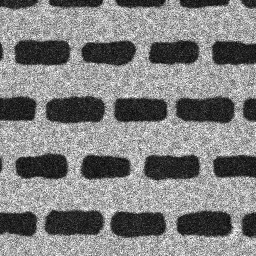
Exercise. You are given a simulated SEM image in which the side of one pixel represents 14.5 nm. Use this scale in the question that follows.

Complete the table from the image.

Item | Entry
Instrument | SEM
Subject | a regular array of holes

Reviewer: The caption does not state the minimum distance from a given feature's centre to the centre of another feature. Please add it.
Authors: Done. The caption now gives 0.94 micrometres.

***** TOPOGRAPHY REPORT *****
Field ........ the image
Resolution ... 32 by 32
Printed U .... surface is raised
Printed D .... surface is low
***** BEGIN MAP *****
DDDDUUDDDDDDDUUDDDDDUUUDDDDDUUDD
UUUUUUUUUUUUUUUUUUUUUUUUUUUUUUUU
UUUUUUUUUUUUUUUUUUUUUUUUUUUUUUUU
UUUUUUUUUUUUUUUUUUUUUUUUUUUUUUUU
UUUUUUUUUUUUUUUUUUUUUUUUUUUUUUUU
UUDDDDDDUUUDDDDDDUUDDDDDDUUDDDDU
UUDDDDDDDUDDDDDDDUUDDDDDDUUDDDDD
UUDDDDDDDUUDDDDDUUUDDDDDDUUDDDDD
UUUUUUUUUUUUUUUUUUUUUUUUUUUUUUUU
UUUUUUUUUUUUUUUUUUUUUUUUUUUUUUUU
UUUUUUUUUUUUUUUUUUUUUUUUUUUUUUUU
UUUUUUUUUUUUUUUUUUUUUUUUUUUUUUUU
DDDDUUDDDDDDDUUDDDDDUUDDDDDDDUUD
DDDDUUDDDDDDDUDDDDDDDUDDDDDDDUDD
DDDDUUDDDDDDDUDDDDDDDUDDDDDDDUDD
UUUUUUUUUUUUUUUUUUUUUUUUUUUUUUUU
UUUUUUUUUUUUUUUUUUUUUUUUUUUUUUUU
UUUUUUUUUUUUUUUUUUUUUUUUUUUUUUUU
UUUUUUUUUUUUUUUUUUUUUUUUUUUUUUUU
UUUUUDDDUUUDUUUUUUUDDUUDUUUUDDDD
UUDDDDDDUUDDDDDDUUDDDDDDDUUDDDDD
UUDDDDDDUUDDDDDDUUDDDDDDDUUDDDDD
UUUUUUUUUUUUUUUUUUUDUUUUUUUUUUUU
UUUUUUUUUUUUUUUUUUUUUUUUUUUUUUUU
UUUUUUUUUUUUUUUUUUUUUUUUUUUUUUUU
UUUUUUUUUUUUUUUUUUUUUUUUUUUUUUUU
UUUDUUDDDDDDUUUUUUUUUUUUUDDDUUUU
DDDDDUDDDDDDDUDDDDDDDUDDDDDDDUDD
DDDDDUDDDDDDDUDDDDDDDUDDDDDDDUDD
UUUUUUUUUUUUUUUDDDUUUUUUUDDDUUUD
UUUUUUUUUUUUUUUUUUUUUUUUUUUUUUUU
UUUUUUUUUUUUUUUUUUUUUUUUUUUUUUUU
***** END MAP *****